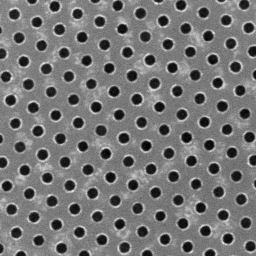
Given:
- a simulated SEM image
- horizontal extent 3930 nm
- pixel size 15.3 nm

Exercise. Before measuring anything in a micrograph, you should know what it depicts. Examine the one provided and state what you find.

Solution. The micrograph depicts a regular array of holes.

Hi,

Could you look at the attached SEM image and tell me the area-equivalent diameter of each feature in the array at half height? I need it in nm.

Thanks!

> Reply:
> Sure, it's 174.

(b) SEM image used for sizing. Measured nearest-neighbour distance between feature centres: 0.363 microns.